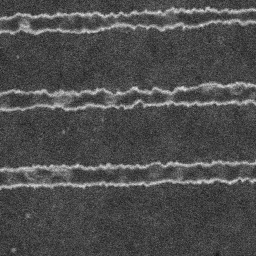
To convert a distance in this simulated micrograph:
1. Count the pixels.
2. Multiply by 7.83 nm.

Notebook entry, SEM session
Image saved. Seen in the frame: one or a few lines or trenches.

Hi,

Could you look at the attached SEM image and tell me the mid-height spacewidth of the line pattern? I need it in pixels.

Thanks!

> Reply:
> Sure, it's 59.8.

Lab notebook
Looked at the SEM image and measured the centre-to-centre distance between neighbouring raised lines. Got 604 nanometres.